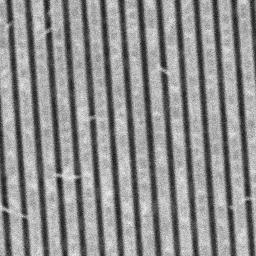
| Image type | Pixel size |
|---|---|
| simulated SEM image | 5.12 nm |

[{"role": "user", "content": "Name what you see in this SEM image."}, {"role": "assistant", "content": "parallel lines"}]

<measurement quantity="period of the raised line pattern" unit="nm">95.5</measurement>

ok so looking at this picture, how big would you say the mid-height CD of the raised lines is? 10.2 pixels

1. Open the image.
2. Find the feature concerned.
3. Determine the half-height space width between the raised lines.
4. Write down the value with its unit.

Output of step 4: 0.0421 micrometres